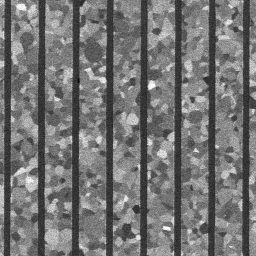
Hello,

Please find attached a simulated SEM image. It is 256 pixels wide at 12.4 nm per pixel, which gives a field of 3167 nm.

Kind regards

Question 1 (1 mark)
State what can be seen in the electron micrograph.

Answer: parallel lines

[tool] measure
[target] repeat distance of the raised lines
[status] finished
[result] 422 nm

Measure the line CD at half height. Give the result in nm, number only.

329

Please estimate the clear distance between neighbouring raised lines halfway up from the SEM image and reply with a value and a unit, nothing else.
89.7 nm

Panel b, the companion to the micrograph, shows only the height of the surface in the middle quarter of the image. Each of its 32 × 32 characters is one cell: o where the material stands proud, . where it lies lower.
oo..oooooo...oooooo..ooooooo..oo
oo..oooooo...oooooo..oooooo...oo
oo..oooooo...oooooo..ooooooo..oo
oo..oooooo...oooooo..ooooooo..oo
oo..oooooo...oooooo..oooooo...oo
oo..oooooo...oooooo..oooooo...oo
oo..oooooo...oooooo..ooooooo..oo
oo..oooooo...oooooo..ooooooo.ooo
oo..oooooo...oooooo..ooooooo..oo
oo..oooooo...oooooo..oooooo...oo
oo..oooooo...oooooo..oooooo...oo
oo..oooooo...oooooo..oooooo...oo
oo..oooooo...oooooo..oooooo...oo
oo..oooooo...oooooo..oooooo...oo
oo..oooooo...oooooo..ooooooo..oo
oo..oooooo...oooooo..ooooooo..oo
oo..oooooo...oooooo..oooooo..ooo
oo..oooooo...oooooo..oooooo...oo
oo..oooooo...oooooo..oooooo...oo
oo..oooooo...oooooo..oooooo...oo
oo..oooooo...oooooo..oooooo...oo
oo..oooooo...oooooo..oooooo...oo
oo..oooooo...oooooo..oooooo...oo
oo..oooooo..ooooooo..oooooo...oo
oo..oooooo..ooooooo..oooooo...oo
oo..oooooo..ooooooo..oooooo...oo
oo..oooooo..ooooooo..oooooo...oo
oo..oooooo..ooooooo..oooooo...oo
oo..oooooo..ooooooo..oooooo...oo
oo..oooooo..ooooooo..oooooo...oo
oo..oooooo..ooooooo..oooooo..ooo
oo..oooooo..ooooooo..oooooo..ooo